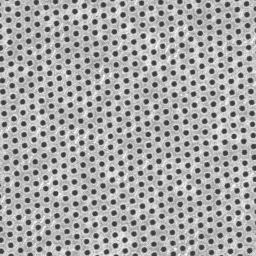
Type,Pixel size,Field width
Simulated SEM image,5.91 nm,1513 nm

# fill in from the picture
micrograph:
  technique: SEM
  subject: a regular array of holes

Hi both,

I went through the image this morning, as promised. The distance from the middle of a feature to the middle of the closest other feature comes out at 0.0636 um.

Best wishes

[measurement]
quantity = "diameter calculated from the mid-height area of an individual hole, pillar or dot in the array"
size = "34 nm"